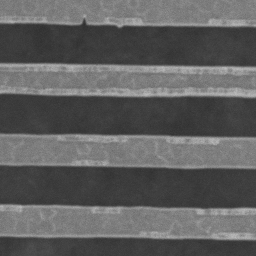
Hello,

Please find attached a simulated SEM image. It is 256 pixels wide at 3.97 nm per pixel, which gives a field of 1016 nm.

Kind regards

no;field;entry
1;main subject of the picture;one or a few lines or trenches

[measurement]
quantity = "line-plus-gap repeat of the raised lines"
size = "282 nm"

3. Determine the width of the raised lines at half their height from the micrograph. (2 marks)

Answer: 117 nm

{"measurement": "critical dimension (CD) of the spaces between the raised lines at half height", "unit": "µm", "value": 0.164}